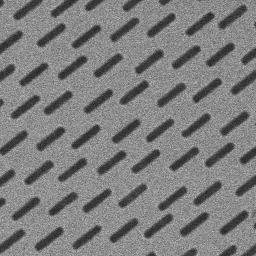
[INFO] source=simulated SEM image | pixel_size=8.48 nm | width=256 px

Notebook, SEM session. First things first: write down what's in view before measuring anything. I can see a regular array of holes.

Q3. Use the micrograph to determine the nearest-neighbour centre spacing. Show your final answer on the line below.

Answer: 34.5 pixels